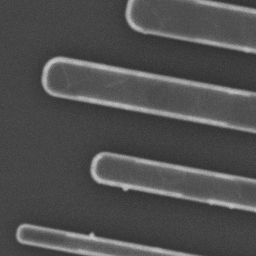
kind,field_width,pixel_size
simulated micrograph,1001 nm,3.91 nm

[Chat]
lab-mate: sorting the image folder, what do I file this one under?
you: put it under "one or a few lines or trenches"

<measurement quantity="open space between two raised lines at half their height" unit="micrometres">0.187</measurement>